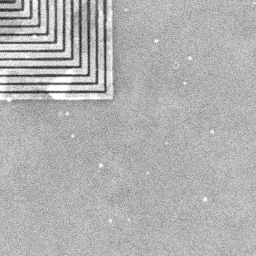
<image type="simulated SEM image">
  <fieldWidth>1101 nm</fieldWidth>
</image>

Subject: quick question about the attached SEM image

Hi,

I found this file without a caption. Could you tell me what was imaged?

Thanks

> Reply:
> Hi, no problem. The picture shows groups of lines, slits or small figures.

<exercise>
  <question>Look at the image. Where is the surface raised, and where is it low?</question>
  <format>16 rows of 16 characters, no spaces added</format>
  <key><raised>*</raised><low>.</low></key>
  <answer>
******..........
***.**..........
*******.........
*******.........
*******.........
*******.........
................
................
................
................
................
................
................
................
................
................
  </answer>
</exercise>